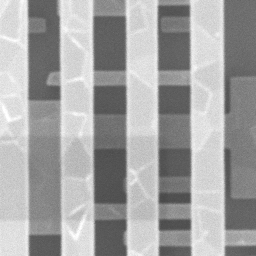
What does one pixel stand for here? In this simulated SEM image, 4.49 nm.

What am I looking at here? wiring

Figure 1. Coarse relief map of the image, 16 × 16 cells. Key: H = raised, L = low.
HHLLHHLLHHLLHHLL
HHLLHHLLHHLLHHLL
HHLLHHLLHHLLHHLL
HHLLHHLLHHLLHHLL
HHLLHHLLHHLLHHLL
HHLLHHLLHHLLHHLL
HHLLHHLLHHLLHHLL
HHLLHHLLHHLLHHLL
HHLLHHLLHHLLHHLL
HHLLHHLLHHLLHHLL
HHLLHHLLHHLLHHLL
HHLLHHLLHHLLHHLL
HHLLHHLLHHLLHHLL
HHLLHHLLHHLLHHLL
HHLLHHLLHHLLHHLL
HHLLHHLLHHLLHHLL